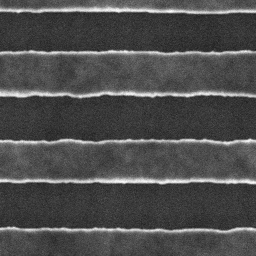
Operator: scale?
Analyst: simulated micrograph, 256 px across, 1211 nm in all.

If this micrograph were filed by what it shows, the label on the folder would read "lines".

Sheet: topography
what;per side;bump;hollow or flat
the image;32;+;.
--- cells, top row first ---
++++++++++++++++++++++++++++++++
..+.++............++++++++++++++
................................
................................
................................
................................
...++........+++..............++
++++++++++++++++++++++++++++++++
++++++++++++++++++++++++++++++++
++++++++++++++++++++++++++++++++
++++++++++++++++++++++++++++++++
++++++++++++++++++++++++++++++++
................................
................................
................................
................................
................................
........++......++++..++++.....+
++++++++++++++++++++++++++++++++
++++++++++++++++++++++++++++++++
++++++++++++++++++++++++++++++++
++++++++++++++++++++++++++++++++
++++++++++++++++++++++++++++++++
................................
................................
................................
................................
................................
.+..............................
++++++++++++++++++++++++++++++++
++++++++++++++++++++++++++++++++
++++++++++++++++++++++++++++++++